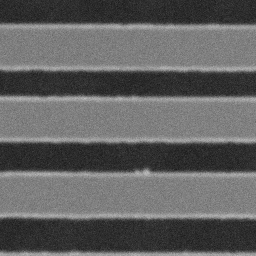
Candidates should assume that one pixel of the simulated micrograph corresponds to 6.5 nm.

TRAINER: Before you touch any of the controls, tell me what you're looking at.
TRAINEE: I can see lines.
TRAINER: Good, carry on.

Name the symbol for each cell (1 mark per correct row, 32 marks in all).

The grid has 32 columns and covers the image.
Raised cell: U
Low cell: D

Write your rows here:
DDDDDDDDDDDDDDDDDDDDDDDDDDDDDDDD
DDDDDDDDDDDDDDDDDDDDDDDDDDDDDDDD
DDDDDDDDDDDDDDDDDDDDDDDDDDDDDDDD
UUUUUUUUUUUUUUUUUUUUUUUUUUUUUUUU
UUUUUUUUUUUUUUUUUUUUUUUUUUUUUUUU
UUUUUUUUUUUUUUUUUUUUUUUUUUUUUUUU
UUUUUUUUUUUUUUUUUUUUUUUUUUUUUUUU
UUUUUUUUUUUUUUUUUUUUUUUUUUUUUUUU
UUUUUUUUUUUUUUUUUUUUUUUUUUUUUUUU
DDDDDDDDDDDDDDDDDDDDDDDDDDDDDDDD
DDDDDDDDDDDDDDDDDDDDDDDDDDDDDDDD
DDDDDDDDDDDDDDDDDDDDDDDDDDDDDDDD
UUUUUUUUUUUUUUUUUUUUUUUUUUUUUUUU
UUUUUUUUUUUUUUUUUUUUUUUUUUUUUUUU
UUUUUUUUUUUUUUUUUUUUUUUUUUUUUUUU
UUUUUUUUUUUUUUUUUUUUUUUUUUUUUUUU
UUUUUUUUUUUUUUUUUUUUUUUUUUUUUUUU
UUUUUUUUUUUUUUUUUUUUUUUUUUUUUUUU
DDDDDDDDDDDDDDDDDDDDDDDDDDDDDDDD
DDDDDDDDDDDDDDDDDDDDDDDDDDDDDDDD
DDDDDDDDDDDDDDDDDDDDDDDDDDDDDDDD
DDDDDDDDDDDDDDDDDDDDDDDDDDDDDDDD
UUUUUUUUUUUUUUUUUUUUUUUUUUUUUUUU
UUUUUUUUUUUUUUUUUUUUUUUUUUUUUUUU
UUUUUUUUUUUUUUUUUUUUUUUUUUUUUUUU
UUUUUUUUUUUUUUUUUUUUUUUUUUUUUUUU
UUUUUUUUUUUUUUUUUUUUUUUUUUUUUUUU
DDDDDDDDDDDDDDDDDDDDDDDDDDDDDDDD
DDDDDDDDDDDDDDDDDDDDDDDDDDDDDDDD
DDDDDDDDDDDDDDDDDDDDDDDDDDDDDDDD
DDDDDDDDDDDDDDDDDDDDDDDDDDDDDDDD
DDDDDDDDDDDDDDDDDDDDDDDDDDDDDDDD